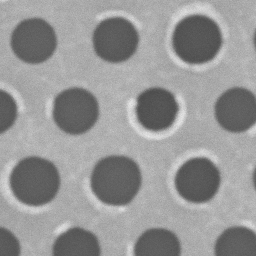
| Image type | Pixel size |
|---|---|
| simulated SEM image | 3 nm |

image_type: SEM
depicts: a regular array of holes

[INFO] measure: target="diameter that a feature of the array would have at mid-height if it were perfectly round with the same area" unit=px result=48.1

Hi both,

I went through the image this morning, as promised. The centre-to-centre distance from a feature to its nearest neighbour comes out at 241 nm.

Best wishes